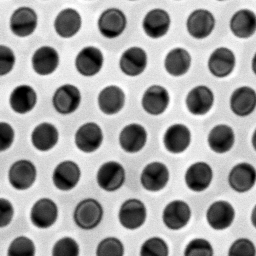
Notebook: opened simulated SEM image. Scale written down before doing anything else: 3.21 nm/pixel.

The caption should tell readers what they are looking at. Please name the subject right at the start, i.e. a regular array of holes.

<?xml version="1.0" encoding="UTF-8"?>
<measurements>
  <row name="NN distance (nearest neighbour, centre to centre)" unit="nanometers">137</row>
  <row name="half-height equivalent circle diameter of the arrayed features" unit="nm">88.1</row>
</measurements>